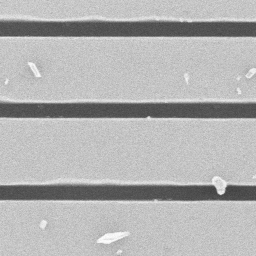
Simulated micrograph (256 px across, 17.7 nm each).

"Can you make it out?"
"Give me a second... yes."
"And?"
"lines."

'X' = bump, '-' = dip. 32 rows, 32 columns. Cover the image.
XXXXXXXXXXXXXXXXXXXXXXXXXXXXXXXX
XXXXXXXXXXXXXXXXXXXXXXXXXXXXXXXX
XXXXXXXXXXXXXXXXXXXXXXXXXXXXXXXX
--------------------------------
--------------------------------
XXXXXXXXXXXXXXXXXXXXXXXXXXXXXXXX
XXXXXXXXXXXXXXXXXXXXXXXXXXXXXXXX
XXXXXXXXXXXXXXXXXXXXXXXXXXXXXXXX
XXXXXXXXXXXXXXXXXXXXXXXXXXXXXXXX
XXXXXXXXXXXXXXXXXXXXXXXXXXXXXXXX
XXXXXXXXXXXXXXXXXXXXXXXXXXXXXXXX
XXXXXXXXXXXXXXXXXXXXXXXXXXXXXXXX
XXXXXXXXXXXXXXXXXXXXXXXXXXXXXXXX
--------------------------------
--------------------------------
XXXXXXXXXXXXXXXXXXXXXXXXXXXXXXXX
XXXXXXXXXXXXXXXXXXXXXXXXXXXXXXXX
XXXXXXXXXXXXXXXXXXXXXXXXXXXXXXXX
XXXXXXXXXXXXXXXXXXXXXXXXXXXXXXXX
XXXXXXXXXXXXXXXXXXXXXXXXXXXXXXXX
XXXXXXXXXXXXXXXXXXXXXXXXXXXXXXXX
XXXXXXXXXXXXXXXXXXXXXXXXXXXXXXXX
XXXXXXXXXXXXXXXXXXXXXXXXXXXXXXXX
---------------------------X----
--------------------------------
XXXXXXXXXXXXXXXXXXXXXXXXXXXXXXXX
XXXXXXXXXXXXXXXXXXXXXXXXXXXXXXXX
XXXXXXXXXXXXXXXXXXXXXXXXXXXXXXXX
XXXXXXXXXXXXXXXXXXXXXXXXXXXXXXXX
XXXXXXXXXXXXXXXXXXXXXXXXXXXXXXXX
XXXXXXXXXXXXXXXXXXXXXXXXXXXXXXXX
XXXXXXXXXXXXXXXXXXXXXXXXXXXXXXXX